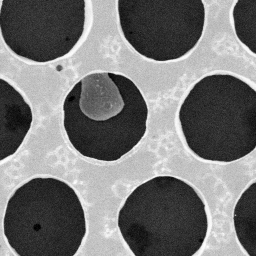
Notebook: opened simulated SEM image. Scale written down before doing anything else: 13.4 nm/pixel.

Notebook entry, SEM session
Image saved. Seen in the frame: holes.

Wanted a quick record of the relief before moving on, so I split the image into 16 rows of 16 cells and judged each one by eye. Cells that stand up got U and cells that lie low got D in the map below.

DDDDDUUDDDDDDUUD
DDDDDUUDDDDDDUUD
DDDDDUUUDDDDUUUD
UDDDUUUUUDDUUUUU
UUUUUUUUUUUUUUUU
DUUUUDDDDUUUDDDD
DDUUDDDDDUUDDDDD
DDUUDDDDDUUDDDDD
DDUUDDDDDUUUDDDD
DUUUUDDDUUUUDDDD
UUUUUUUUUUUUUUUU
UDDDUUUUUDDDUUUU
UDDDDUUUDDDDDUUD
DDDDDUUDDDDDDUUD
DDDDDUUUDDDDDUUD
UDDDDUUUDDDDUUUD